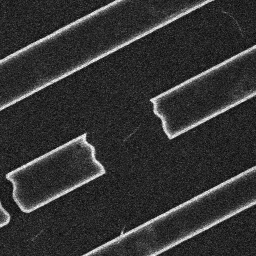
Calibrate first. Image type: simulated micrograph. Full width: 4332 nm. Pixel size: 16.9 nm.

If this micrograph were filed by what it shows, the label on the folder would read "one or a few lines or trenches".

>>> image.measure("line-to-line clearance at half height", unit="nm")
1100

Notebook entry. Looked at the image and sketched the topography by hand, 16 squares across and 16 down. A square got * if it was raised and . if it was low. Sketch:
......******....
....******......
...*****........
.*****.........*
*****........***
***........*****
*.........*****.
..........***...
................
...***..........
.*****..........
.****.........**
.**.........****
..........****..
........****....
......****......